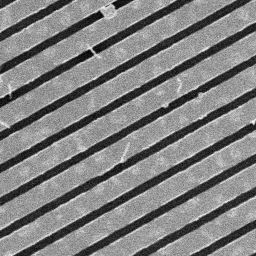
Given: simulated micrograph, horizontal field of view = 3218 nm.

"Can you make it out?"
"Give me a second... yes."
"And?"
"parallel lines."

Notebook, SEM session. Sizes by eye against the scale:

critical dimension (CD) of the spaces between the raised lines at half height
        100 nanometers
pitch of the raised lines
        361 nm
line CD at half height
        255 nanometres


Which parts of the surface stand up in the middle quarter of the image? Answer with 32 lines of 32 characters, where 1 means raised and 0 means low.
00011111111110000011111111110000
01111111111100001111111111000001
11111111110000111111111110000111
11111111000011111111111000011111
11111100001111111111100001111111
11110000011111111110000111111111
11100001111111111000001111111111
10000111111111100000111111111100
00001111111110000011111111110000
01111111111100001111111111100001
11111111110000111111111111000111
11111111000001111111111000011111
11111110000111111111100000111111
11111000011111111110000011111111
11100001111111111100001111111111
10000111111111110000111111111110
00001111111111000011111111111000
00111111111100001111111111100001
11111111110000011111111110000011
11111111100001111111111000001111
11111110000111111111110000111111
11111000011111111111000011111111
11100001111111111100001111111111
11000011111111110000011111111110
00001111111111100001111111111000
00111111111110000111111111100000
01111111111000011111111111000011
11111111110001111111111100001111
11111110000011111111110000111111
11111000001111111111000001111111
11100000111111111100000111111111
11000011111111111000011111111110